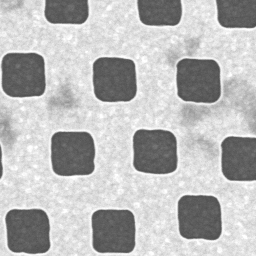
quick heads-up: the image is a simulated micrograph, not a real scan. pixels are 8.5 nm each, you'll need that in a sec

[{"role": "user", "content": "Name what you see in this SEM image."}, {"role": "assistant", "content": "a regular array of holes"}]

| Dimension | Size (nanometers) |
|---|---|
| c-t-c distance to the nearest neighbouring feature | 706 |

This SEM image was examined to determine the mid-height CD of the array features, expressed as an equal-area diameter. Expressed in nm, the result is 410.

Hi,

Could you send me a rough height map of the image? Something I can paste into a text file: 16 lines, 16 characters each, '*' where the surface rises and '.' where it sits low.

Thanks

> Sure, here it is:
***...***..***..
****.****..***..
****************
..**************
...***..***...**
...***...**...**
****************
****************
***...**...*****
***...**...***..
***...***..***..
****************
***********..***
...***..***...**
...***..***...**
*..***..********